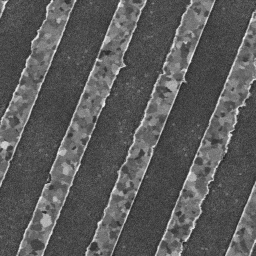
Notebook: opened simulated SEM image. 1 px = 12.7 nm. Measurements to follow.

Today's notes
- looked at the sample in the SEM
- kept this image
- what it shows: one or a few lines or trenches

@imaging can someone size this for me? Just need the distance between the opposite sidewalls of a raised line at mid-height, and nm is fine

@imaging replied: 292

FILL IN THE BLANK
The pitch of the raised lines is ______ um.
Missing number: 0.819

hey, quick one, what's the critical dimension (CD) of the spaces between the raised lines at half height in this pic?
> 524 nanometres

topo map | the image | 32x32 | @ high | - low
@-----@@@------@@@------@@@-----
------@@@-----@@@@-----@@@------
------@@------@@@------@@@-----@
-----@@@------@@@-----@@@------@
-----@@@-----@@@------@@@------@
----@@@------@@@------@@@-----@@
----@@@-----@@@@-----@@@------@@
---@@@------@@@------@@@-----@@@
---@@@------@@@-----@@@------@@@
---@@@-----@@@@-----@@@------@@@
--@@@------@@@-----@@@@-----@@@-
--@@@-----@@@@-----@@@------@@@-
-@@@------@@@------@@@-----@@@@-
-@@@------@@@-----@@@------@@@--
@@@@-----@@@------@@@------@@@--
@@@------@@@------@@@-----@@@---
@@@-----@@@------@@@------@@@---
@@------@@@------@@@-----@@@@---
@@-----@@@@-----@@@------@@@----
@@-----@@@------@@@-----@@@@----
@------@@@------@@@-----@@@-----
@-----@@@------@@@------@@@-----
------@@@------@@@-----@@@------
------@@@-----@@@------@@@------
-----@@@------@@@-----@@@@-----@
-----@@@------@@------@@@------@
----@@@------@@@------@@@-----@@
----@@@------@@@-----@@@------@@
---@@@@-----@@@------@@@------@@
---@@@------@@@------@@@-----@@@
---@@@-----@@@------@@@------@@@
--@@@------@@@------@@@-----@@@-